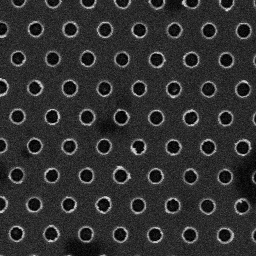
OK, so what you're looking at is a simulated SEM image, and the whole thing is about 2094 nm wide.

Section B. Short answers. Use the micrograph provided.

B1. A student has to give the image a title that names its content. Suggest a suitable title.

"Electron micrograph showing a regular array of holes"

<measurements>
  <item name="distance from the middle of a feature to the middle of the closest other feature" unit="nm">275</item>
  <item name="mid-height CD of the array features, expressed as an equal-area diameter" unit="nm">105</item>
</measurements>